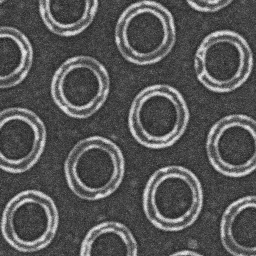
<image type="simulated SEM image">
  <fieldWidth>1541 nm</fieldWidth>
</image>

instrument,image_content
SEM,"ring-shaped raised bodies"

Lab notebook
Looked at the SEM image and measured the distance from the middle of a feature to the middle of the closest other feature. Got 500 nm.